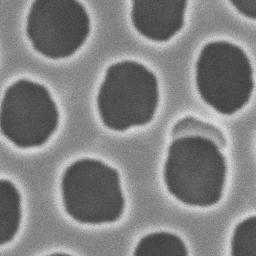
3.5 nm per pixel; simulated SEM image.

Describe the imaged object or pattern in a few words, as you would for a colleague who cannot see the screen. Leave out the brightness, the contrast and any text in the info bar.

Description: holes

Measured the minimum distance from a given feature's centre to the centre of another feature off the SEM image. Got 345 nm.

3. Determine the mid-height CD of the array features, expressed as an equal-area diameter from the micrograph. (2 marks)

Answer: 233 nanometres